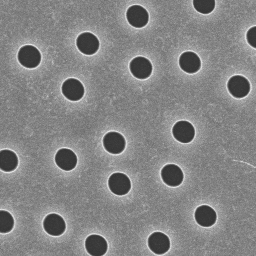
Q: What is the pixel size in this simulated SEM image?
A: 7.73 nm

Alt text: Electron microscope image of a regular array of holes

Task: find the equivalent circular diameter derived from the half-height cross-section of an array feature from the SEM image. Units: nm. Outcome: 172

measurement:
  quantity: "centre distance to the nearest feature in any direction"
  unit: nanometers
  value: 382